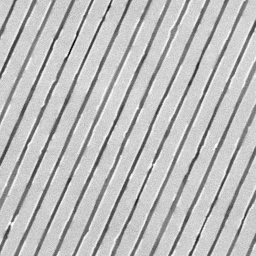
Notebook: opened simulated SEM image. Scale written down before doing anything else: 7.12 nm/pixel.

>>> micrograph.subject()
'parallel lines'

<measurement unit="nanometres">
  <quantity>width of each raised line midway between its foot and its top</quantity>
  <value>95.8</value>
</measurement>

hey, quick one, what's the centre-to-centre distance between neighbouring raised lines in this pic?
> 125 nanometers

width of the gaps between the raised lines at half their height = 3.76 pixels